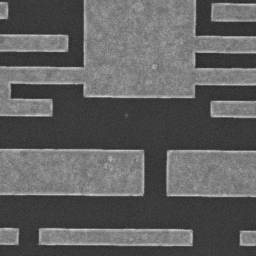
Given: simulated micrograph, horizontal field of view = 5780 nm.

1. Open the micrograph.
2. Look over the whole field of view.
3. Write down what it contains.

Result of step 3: wiring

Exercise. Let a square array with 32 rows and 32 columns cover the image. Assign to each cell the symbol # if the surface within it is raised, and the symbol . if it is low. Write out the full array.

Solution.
#..........#############...###..
#..........#############..######
...........#############...#####
...........#############........
########...##############.......
########...#####################
...........##############..#####
...........#############........
#######...###############.......
################################
##........######################
#..........#############........
######..........................
######....................######
...........................#####
................................
................................
................................
................................
##################...###########
##################...###########
##################...###########
##################...###########
##################...###########
.........................#######
................................
................................
................................
................................
##...###################......##
##...###################......##
................................